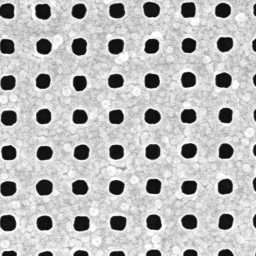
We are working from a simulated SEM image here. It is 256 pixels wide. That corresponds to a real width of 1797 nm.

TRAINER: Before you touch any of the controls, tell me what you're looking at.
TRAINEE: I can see a regular array of holes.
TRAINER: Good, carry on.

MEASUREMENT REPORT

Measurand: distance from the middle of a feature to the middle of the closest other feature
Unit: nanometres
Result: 244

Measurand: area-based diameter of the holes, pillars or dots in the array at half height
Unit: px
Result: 15.7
